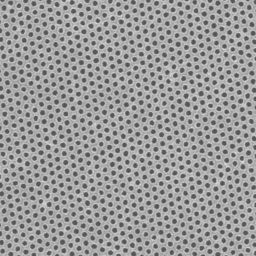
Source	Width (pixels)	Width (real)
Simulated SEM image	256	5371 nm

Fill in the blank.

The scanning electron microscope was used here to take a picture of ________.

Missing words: a regular array of holes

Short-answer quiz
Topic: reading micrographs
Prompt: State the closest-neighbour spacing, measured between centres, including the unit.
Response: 177 nanometers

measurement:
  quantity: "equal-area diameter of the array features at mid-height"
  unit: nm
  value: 108